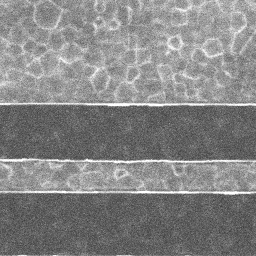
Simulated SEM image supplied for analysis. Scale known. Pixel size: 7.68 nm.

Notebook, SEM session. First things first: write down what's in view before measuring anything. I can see one or a few lines or trenches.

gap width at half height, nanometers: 232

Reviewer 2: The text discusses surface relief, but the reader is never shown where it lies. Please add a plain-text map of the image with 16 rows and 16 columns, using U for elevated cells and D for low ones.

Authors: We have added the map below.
DDDDDDDDDDDDDDDD
DDDDDDDDDDDDDDDD
DDDDDDDDDDDDDDDD
DDDDDDDDDDDDDDDD
DDDDDDDDDDDDDDDD
DDDDDDDDDDDDDDDD
DUUUUDDUUUDUUUDD
UUUUUUUUUUUUUUUU
UUUUUUUUUUUUUUUU
UUUUUUUUUUUUUUUU
DDDDDDDDDDDDDDDD
DDDDDDDDDDDDDDDD
UUUUUUUUUUUUUUUU
UUUUUUUUUUUUUUUU
UUUUUUUUUUUUUUUU
UUUUUUUUUUUUUUUU